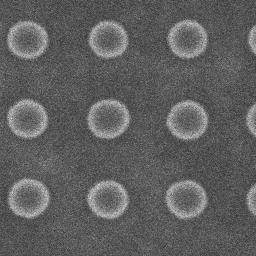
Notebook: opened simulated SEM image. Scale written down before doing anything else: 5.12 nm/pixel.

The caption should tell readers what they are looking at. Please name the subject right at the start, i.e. a regular array of raised bodies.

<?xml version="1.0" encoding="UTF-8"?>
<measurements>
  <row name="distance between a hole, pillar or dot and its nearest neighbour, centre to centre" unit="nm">404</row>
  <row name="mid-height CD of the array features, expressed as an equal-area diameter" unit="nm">194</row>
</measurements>